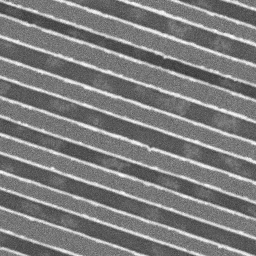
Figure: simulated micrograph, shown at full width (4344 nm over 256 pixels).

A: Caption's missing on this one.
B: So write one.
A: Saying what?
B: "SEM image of parallel lines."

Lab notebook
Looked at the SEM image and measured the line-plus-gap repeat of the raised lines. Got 0.615 um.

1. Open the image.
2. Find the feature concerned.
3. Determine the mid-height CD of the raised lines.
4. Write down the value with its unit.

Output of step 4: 18.7 px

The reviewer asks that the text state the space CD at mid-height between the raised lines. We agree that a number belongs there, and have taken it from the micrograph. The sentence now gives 288 nm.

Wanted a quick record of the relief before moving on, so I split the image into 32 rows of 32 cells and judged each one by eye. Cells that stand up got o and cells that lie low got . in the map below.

.oooooooo.......ooooooo.......oo
....oooooooo........oooooo......
oo.....oooooooo........oooooo...
ooooo.....oooooooo........oooooo
oooooooo.....oooooooo........ooo
...oooooooo.....oooooooo........
......oooooooo.....oooooooo.....
o........oooooooo.....oooooooo..
oooo........oooooooo.....ooooooo
ooooooo........oooooooo.....oooo
..oooooooo........oooooooo.....o
.....oooooooo........oooooooo...
o.......oooooooo........oooooooo
oooo.......oooooooo........ooooo
ooooooo.......oooooooo........oo
...ooooooo.......oooooooo.......
.....oooooooo.......oooooooo....
oo......oooooooo.......oooooooo.
ooooo......oooooooo.......oooooo
.ooooooo......oooooooo.......ooo
....ooooooo......oooooooo.......
.......ooooooo.......ooooooo....
ooo.......ooooooo.......ooooooo.
oooooo.......ooooooo.......ooooo
...oooooo.......ooooooo......ooo
......oooooo.......ooooooo......
oo.......oooooo.......ooooooo...
ooooo.......oooooo.......ooooooo
oooooooo.......oooooo.......oooo
..ooooooooo.......oooooo.......o
.....ooooooooo.......oooooo.....
oo......ooooooooo.......oooooo..